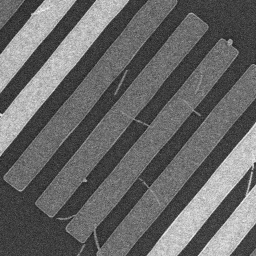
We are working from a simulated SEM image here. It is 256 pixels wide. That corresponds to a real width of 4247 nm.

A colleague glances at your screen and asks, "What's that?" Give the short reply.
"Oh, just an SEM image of groups of lines, slits or small figures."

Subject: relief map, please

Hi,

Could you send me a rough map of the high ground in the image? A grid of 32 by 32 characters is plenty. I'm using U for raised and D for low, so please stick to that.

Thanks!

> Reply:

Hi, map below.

UUUDDUUUUDDDUUUUDDUUUUDDDDDDDDDD
UUDDUUUUDDDUUUUDDUUUUDDDDDDDDDDD
UDDDUUUDDDUUUUDDUUUUDDDUUDDDDDDD
DDDUUUUDDUUUUDDDUUUUDDUUUUDDDDDD
DDUUUUDDUUUUDDDUUUUDDUUUUDDDDDDD
DUUUUDDDUUUDDDUUUUDDDUUUDDDUUDDD
UUUUDDDUUUUDDUUUUDDDUUUUDDUUUUDD
UUUDDDUUUUDDUUUUDDDUUUUDDUUUUDDD
UUUDDUUUUDDDUUUUDDUUUUDDDUUUDDDU
UUDDUUUUDDDUUUUDDUUUUDDDUUUUDDUU
UDDUUUUDDDUUUUDDUUUUDDDUUUUDDUUU
DDDUUUUDDUUUUDDDUUUUDDUUUUDDDUUU
DDUUUUDDUUUUDDDUUUUDDUUUUDDDUUUU
DUUUUDDDUUUDDDUUUUDDUUUUDDDUUUUD
UUUUDDDUUUUDDUUUUDDDUUUUDDUUUUDD
UUUDDDUUUUDDUUUUDDDUUUUDDUUUUDDD
UUDDDUUUUDDDUUUDDDUUUUDDUUUUDDDU
UUDDUUUUDDDUUUUDDUUUUDDDUUUUDDUU
UDDUUUUDDDUUUUDDUUUUDDDUUUUDDUUU
DDDUUUDDDUUUUDDDUUUDDDUUUUDDDUUU
DDUUUUDDUUUUDDDUUUUDDUUUUDDDUUUU
DUUUUDDUUUUDDDUUUUDDUUUUDDDUUUUD
DUUUDDDUUUUDDUUUUDDDUUUDDDUUUUDD
DDUDDDUUUUDDUUUUDDDUUUUDDUUUUDDD
DDDDDUUUUDDUUUUDDDUUUUDDUUUUDDDU
DDDDDUUUDDDUUUUDDUUUUDDDUUUDDDUU
DDDDDDUDDDUUUUDDUUUUDDDUUUUDDUUU
DDDDDDDDDUUUUDDUUUUDDDUUUUDDUUUU
DDDDDDDDUUUUDDDUUUUDDUUUUDDDUUUD
DDDDDDDDDUUDDDUUUUDDUUUUDDDUUUUD
DDDDDDDDDDDDDUUUUDDDUUUDDDUUUUDD
DDDDDDDDDDDDUUUUDDDUUUUDDUUUUDDD